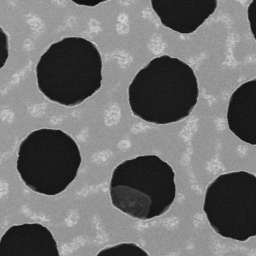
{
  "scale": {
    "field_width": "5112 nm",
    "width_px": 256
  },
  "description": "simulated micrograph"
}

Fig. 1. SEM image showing holes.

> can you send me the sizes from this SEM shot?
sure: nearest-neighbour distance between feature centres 1880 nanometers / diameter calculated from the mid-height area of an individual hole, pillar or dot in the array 1310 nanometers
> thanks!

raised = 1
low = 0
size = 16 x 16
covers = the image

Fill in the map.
1111111111000111
1111111111000111
1111011111111111
1110001111111111
1100001110001111
1110001100001110
1111011100001100
1111111110011100
1100111111111110
1000011111111111
1000011000011111
1100111000011000
1111111000011000
1111111100111000
0001111111111100
0000111001111111